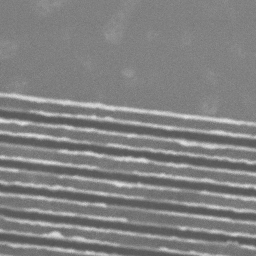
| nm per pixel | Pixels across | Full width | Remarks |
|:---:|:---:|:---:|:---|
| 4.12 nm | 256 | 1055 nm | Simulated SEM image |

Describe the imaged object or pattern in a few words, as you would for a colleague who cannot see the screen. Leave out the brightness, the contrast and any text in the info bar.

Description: parallel lines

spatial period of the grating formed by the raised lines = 101 nm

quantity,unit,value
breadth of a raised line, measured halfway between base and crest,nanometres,64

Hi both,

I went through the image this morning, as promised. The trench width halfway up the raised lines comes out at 35.8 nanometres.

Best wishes